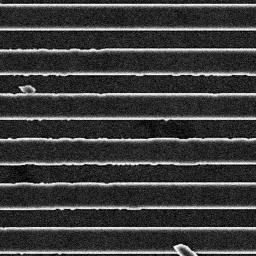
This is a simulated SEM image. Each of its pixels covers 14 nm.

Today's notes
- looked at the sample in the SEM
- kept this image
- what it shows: lines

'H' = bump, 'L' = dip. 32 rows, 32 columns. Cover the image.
LLLLLLLLLLLLLLLLLLLLLLLLLLLLLLLL
HHHHHHHHHHHHHHHHHHHHHHHHHHHHHHHH
HHHHHHHHHHHHHHHHHHHHHHHHHHHHHHHH
HHHHHHHHHHHHHHHHHHHHHHHHHHHHHHHH
LLLLLLLLLLLLLLLLLLLLLLLLLLLLLLLL
LLLLLLLLLLLLLLLLLLLLLLLLLLLLLLLL
HHHHHHHHHHHHHHHHHHHHHHHHHHHHHHHH
HHHHHHHHHHHHHHHHHHHHHHHHHHHHHHHH
HHHHHHHHHHHHHHHHHHHHHHHHHHHHHHHH
LLLLLLLLLLLLLLLLLLLLLLLLLLLLLLLL
LLLLLLLLLLLLLLLLLLLLLLLLLLLLLLLL
LLLHHLLLLLLLLLLLLLLLLLLLLLLLLLLL
HHHHHHHHHHHHHHHHHHHHHHHHHHHHHHHH
HHHHHHHHHHHHHHHHHHHHHHHHHHHHHHHH
HHHHHHHHHHHHHHHHHHHHHHHHHHHHHHHH
LLLLLLLLLLLLLLLLLLLLLLLLLLLLLLLL
LLLLLLLLLLLLLLLLLLLLLLLLLLLLLLLL
HHHHHHHHHHHHHHHHHHHHHHHHHHHHHHHH
HHHHHHHHHHHHHHHHHHHHHHHHHHHHHHHH
HHHHHHHHHHHHHHHHHHHHHHHHHHHHHHHH
HHHHHHHHHHHLHHHHHHHHLHHHHHLLLLLL
LLLLLLLLLLLLLLLLLLLLLLLLLLLLLLLL
LLLLLLLLLLLLLLLLLLLLLLLLLLLLLLLL
HHHHHHHHHHHHHHHHHHHHHHHHHHHHHHHH
HHHHHHHHHHHHHHHHHHHHHHHHHHHHHHHH
HHHHHHHHHHHHHHHHHHHHHHHHHHHHHHHH
LLLLLLLLLLLLLLLLLLLLLLLLLLLLLLLL
LLLLLLLLLLLLLLLLLLLLLLLLLLLLLLLL
LLLLLLLLLLLLLLLLLLLLLLLLLLLLLLLL
HHHHHHHHHHHHHHHHHHHHHHHHHHHHHHHH
HHHHHHHHHHHHHHHHHHHHHHHHHHHHHHHH
HHHHHHHHHHHHHHHHHHHHHHHHHHHHHHHH